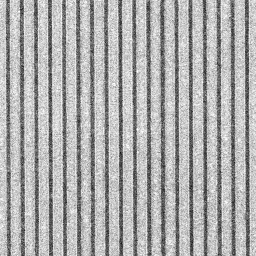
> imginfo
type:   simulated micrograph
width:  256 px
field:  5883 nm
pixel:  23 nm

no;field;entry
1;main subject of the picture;parallel lines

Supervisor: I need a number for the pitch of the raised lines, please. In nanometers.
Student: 323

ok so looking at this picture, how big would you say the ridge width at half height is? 213 nm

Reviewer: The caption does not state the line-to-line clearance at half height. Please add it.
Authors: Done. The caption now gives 106 nm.